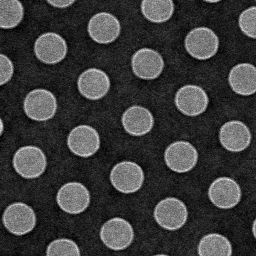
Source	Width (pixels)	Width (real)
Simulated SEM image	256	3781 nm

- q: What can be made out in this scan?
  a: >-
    a regular array of raised bodies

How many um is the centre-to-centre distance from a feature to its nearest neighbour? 0.833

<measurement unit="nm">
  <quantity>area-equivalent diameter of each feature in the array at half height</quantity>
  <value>465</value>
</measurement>